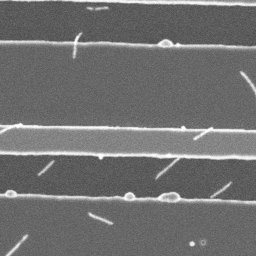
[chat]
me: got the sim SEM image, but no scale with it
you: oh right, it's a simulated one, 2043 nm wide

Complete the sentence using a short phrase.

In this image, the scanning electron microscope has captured lines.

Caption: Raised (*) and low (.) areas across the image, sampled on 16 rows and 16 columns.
................
................
................
****************
****************
****************
****************
****************
****************
****************
................
................
**************..
****************
****************
****************